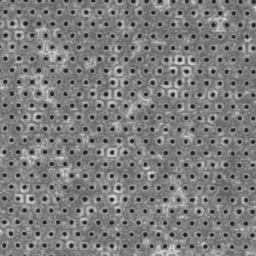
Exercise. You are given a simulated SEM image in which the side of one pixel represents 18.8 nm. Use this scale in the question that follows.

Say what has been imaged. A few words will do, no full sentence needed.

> a regular array of holes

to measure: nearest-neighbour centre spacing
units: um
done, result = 0.248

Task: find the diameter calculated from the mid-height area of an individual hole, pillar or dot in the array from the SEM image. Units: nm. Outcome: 87.6